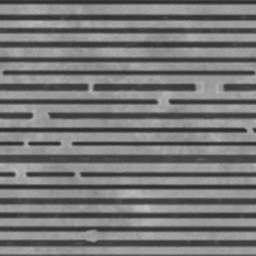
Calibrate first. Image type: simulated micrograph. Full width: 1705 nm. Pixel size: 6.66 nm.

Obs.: parallel lines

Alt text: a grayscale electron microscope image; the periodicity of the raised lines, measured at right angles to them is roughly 94.5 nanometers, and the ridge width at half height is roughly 53.3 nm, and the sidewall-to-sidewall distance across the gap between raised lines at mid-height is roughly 6.01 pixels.